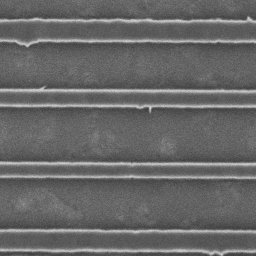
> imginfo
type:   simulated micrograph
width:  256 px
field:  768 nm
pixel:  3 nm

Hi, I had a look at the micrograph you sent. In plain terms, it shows one or a few lines or trenches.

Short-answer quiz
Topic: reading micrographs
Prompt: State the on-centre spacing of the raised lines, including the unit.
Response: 210 nm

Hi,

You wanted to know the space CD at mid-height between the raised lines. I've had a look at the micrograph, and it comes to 159 nm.